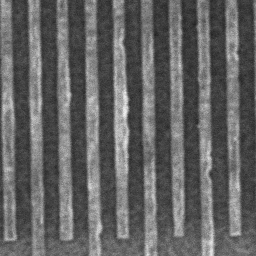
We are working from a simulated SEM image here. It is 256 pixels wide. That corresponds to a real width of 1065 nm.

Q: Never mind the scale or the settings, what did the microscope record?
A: parallel lines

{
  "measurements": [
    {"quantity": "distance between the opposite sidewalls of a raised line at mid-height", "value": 45.7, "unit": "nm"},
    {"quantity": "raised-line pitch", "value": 0.117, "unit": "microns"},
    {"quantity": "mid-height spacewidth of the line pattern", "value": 72.7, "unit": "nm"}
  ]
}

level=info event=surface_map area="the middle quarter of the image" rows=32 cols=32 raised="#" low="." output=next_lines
#.....##.....##.....##.....##...
#.....##.....##.....##.....##...
#.....##.....##.....##.....##...
#.....##.....##.....##.....##...
#.....##.....##.....##.....##...
#.....##.....##.....##.....##...
#.....##.....###....##.....##...
##....##.....###....##.....###..
##....##.....###....##.....###..
#.....##.....###....##.....###..
#.....##.....###....##.....###..
#.....##.....###....###....##...
#.....##.....###....###....##...
#.....##.....###....##.....###..
#.....##.....###....##.....###..
#.....##.....###....###....###..
#.....##.....###....###....###..
#.....##.....###....###....###..
#.....##.....###....###....###..
#.....##.....###....###....###..
#.....##.....###....###....###..
#.....##.....###....###....###..
#.....##.....###....###....###..
#.....###....###....###....###..
#.....###....###....###....###..
##....###....###....##.....###..
##....###....###....##.....###..
##....###....###....###....###..
##....###....###....###....###..
##....###....###....###....###..
##....###....###....###....###..
##....###....###....###....###..